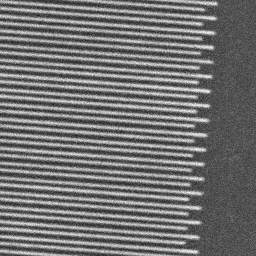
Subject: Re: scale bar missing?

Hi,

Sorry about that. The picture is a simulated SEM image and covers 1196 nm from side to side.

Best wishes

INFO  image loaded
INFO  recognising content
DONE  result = parallel lines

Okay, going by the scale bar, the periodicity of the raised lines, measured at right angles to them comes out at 34.2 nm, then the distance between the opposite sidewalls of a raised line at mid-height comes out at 0.0093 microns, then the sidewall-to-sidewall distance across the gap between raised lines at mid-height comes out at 4.99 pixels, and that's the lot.